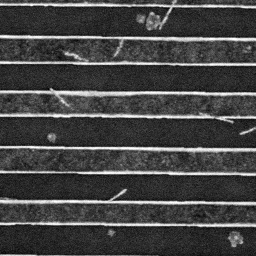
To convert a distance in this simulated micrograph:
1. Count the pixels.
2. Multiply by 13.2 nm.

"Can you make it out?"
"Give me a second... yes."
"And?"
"lines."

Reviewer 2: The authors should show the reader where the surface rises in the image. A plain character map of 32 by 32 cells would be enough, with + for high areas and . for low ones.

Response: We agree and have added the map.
++++++++++++++++++++++++++++++++
................................
................................
................................
................................
++++++++++++++++++++++++++++++++
++++++++++++++++++++++++++++++++
++++++++++++++++++++++++++++++++
................................
................................
................................
......+.........................
++++++++++++++++++++++++++++++++
++++++++++++++++++++++++++++++++
................++++++++++++++++
................................
................................
................................
++++++++++++....................
++++++++++++++++++++++++++++++++
++++++++++++++++++++++++++++++++
++++++++++++++++++++++++++++++++
................................
................................
................................
++++++++++++++++++++++++++++++++
++++++++++++++++++++++++++++++++
++++++++++++++++++++++++++++++++
................................
................................
................................
................................